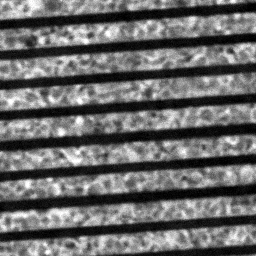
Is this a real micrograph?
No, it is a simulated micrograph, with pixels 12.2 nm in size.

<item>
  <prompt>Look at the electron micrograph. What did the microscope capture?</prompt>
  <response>parallel lines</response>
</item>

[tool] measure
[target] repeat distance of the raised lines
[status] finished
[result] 368 nm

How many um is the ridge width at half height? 0.233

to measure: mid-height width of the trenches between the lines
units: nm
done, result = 138